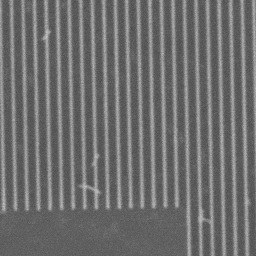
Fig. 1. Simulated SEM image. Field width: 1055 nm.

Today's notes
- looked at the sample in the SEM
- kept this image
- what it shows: parallel lines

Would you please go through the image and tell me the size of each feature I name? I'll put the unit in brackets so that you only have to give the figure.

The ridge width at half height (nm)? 10.8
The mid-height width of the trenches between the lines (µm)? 0.0366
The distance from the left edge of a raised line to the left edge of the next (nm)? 47.6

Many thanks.